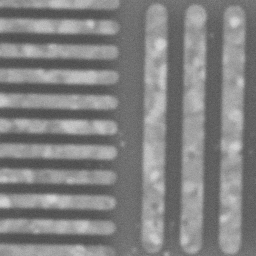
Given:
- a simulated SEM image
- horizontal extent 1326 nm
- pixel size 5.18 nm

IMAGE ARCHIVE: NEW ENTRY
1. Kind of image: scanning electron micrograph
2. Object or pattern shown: groups of lines, slits or small figures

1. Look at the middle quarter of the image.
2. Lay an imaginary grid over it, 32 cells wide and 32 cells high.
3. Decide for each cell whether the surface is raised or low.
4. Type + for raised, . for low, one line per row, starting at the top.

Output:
....................++++++....++
....................+++++.....++
+++++++++++++.......+++++.....++
+++++++++++++.......+++++.....++
+++++++++++++.......+++++.....++
....................+++++.....++
....................+++++.....++
....................+++++.....++
+++++++++++++.......+++++.....++
+++++++++++++.......+++++.....++
+++++++++++++.......+++++.....++
....................+++++.....++
....................+++++.....++
....................+++++.....++
++++++++++++........+++++.....++
+++++++++++++.......+++++.....++
+++++++++++++.......+++++.....++
....................+++++.....++
....................+++++.....++
....................+++++.....++
+++++...............+++++.....++
+++++++++++++.......+++++.....++
+++++++++++++.......+++++.....++
++++++++++++........+++++.....++
....................+++++.....++
....................+++++.....++
....................+++++.....++
+++++++++++++.......+++++.....++
+++++++++++++.......+++++.....++
+++++++++++++.......+++++.....++
....................+++++.....++
....................+++++.....++